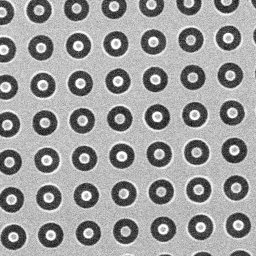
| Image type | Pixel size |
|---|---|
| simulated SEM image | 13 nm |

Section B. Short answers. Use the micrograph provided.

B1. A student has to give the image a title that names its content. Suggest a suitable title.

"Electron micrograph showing an array of small figures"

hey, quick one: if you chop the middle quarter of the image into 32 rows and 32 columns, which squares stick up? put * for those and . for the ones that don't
*******************************.
****.*******...*****.....****...
**....*****.....****......***...
*......***...*...***..**..***..*
*..**..***...*...***..**..***...
*..**..***.......***......****..
*......****.....*****....******.
**....******..******************
********************************
********************************
*************..******....*****..
***....****.....****......****..
**......***......***...*...**...
*...*...***..**..***..**...**...
*...**..***..**..***......****..
*.......***......****.....*****.
**.....*****....******..********
****.***************************
********************************
**********************...******.
****..******.....****.....****..
**......***......****......***..
**......***...*...***..**..***..
**..**...**...*...***..*...***..
**..**..***......****......****.
**......****.....*****....******
****...*************************
********************************
************************.*******
*****.*******....*****.....****.
***.....****......***......****.
***......***..*...***..**...**..